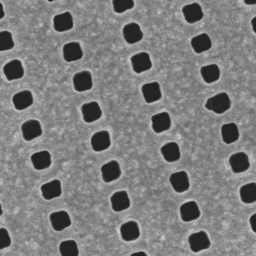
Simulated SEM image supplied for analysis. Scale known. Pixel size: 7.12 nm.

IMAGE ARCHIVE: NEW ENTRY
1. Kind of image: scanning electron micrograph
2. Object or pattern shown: a regular array of holes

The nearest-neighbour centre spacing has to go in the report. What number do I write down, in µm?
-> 0.222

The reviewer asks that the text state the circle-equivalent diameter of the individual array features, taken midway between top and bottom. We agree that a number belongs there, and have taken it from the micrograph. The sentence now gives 0.138 µm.